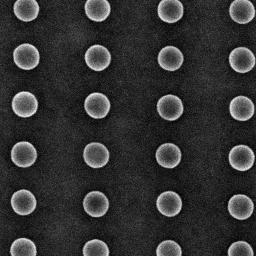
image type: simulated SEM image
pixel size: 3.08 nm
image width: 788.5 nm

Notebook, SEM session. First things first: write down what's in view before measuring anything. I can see a regular array of raised bodies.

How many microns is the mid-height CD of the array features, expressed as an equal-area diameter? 0.0772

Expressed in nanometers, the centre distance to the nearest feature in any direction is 148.